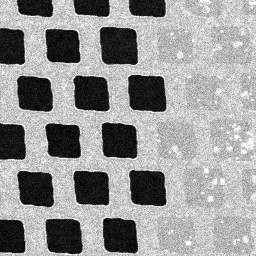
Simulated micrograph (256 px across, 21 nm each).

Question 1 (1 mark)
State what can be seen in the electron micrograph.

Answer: a regular array of holes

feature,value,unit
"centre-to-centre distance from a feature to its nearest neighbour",1.15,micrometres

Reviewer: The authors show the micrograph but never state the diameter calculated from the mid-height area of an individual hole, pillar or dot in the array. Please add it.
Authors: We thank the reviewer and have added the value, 808 nanometres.